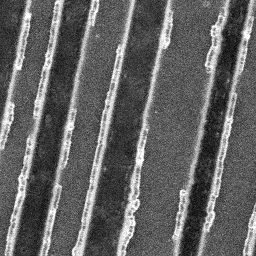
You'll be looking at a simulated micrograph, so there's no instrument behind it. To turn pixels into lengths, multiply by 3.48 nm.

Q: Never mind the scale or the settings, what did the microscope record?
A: one or a few lines or trenches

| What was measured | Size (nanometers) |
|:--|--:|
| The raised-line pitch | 274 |